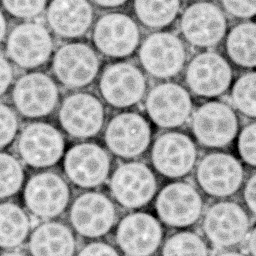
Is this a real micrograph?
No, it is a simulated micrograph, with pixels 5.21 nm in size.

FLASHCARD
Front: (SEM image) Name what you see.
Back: a regular array of raised bodies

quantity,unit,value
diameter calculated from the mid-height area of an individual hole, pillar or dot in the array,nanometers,214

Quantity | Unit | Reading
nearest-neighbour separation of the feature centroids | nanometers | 260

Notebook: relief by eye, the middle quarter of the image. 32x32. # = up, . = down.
########.....###....#########...
########...#######...#######...#
########...########....####....#
#######...#########............#
######....##########............
.........###########.....##.....
..........#########....######...
..........#########...########..
..#####....#######...##########.
.#######....#####....##########.
#########............##########.
#########............##########.
#########.............#########.
#########....######...########..
#########...########....#####...
#########..#########............
.#######...##########...........
..#####....##########...........
...........##########....#####..
...........##########...#######.
.....##.....########...#########
..#######....######....#########
.#########.....##......#########
.#########.............#########
.##########............#########
.##########....####....#########
.##########...######....#######.
.#########...########....####...
..########..##########..........
...######...##########..........
............##########.....###..
.............#########...#######